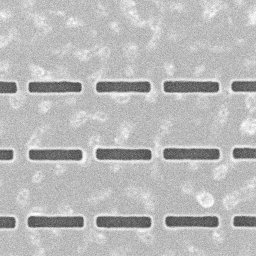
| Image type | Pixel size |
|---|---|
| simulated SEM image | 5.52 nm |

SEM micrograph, a regular array of holes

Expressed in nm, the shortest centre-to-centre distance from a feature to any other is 371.